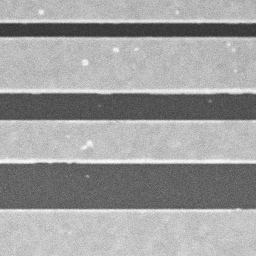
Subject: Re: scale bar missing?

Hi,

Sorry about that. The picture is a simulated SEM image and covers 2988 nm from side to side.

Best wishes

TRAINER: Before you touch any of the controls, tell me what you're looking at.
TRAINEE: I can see lines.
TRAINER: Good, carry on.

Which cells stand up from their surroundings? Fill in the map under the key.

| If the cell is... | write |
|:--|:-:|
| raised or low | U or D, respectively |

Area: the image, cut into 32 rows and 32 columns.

UUUUUUUUUUUUUUUUUUUUUUUUUUUUUUUU
UUUUUUUUUUUUUUUUUUUUUUUUUUUUUUUU
UUUUUUUUUUUUUUUUUUUUUUUUUUUUUUUU
DDDDDDDDDDDDDDDDDDDDDDDDDDDDDDDD
DDDDDDDDDDDDDDDDDDDDDDDDDDDDDDDD
UUUUUUUUUUUUUUUUUUUUUUUUUUUUUUUU
UUUUUUUUUUUUUUUUUUUUUUUUUUUUUUUU
UUUUUUUUUUUUUUUUUUUUUUUUUUUUUUUU
UUUUUUUUUUUUUUUUUUUUUUUUUUUUUUUU
UUUUUUUUUUUUUUUUUUUUUUUUUUUUUUUU
UUUUUUUUUUUUUUUUUUUUUUUUUUUUUUUU
UUUUUUUUUDUUUUUUUUUUUUUUUUUUUUUU
DDDDDDDDDDDDDDDDDDDDDDDDDDDDDDDD
DDDDDDDDDDDDDDDDDDDDDDDDDDDDDDDD
DDDDDDDDDDDDDDDDDDDDDDDDDDDDDDDD
UUUUUUUUUUUUUUUUUUUUUUUUUUUUUUUU
UUUUUUUUUUUUUUUUUUUUUUUUUUUUUUUU
UUUUUUUUUUUUUUUUUUUUUUUUUUUUUUUU
UUUUUUUUUUUUUUUUUUUUUUUUUUUUUUUU
UUUUUUUUUUUUUUUUUUUUUUUUUUUUUUUU
DDDDDDDDDDDDDDDDDDDDDDDDDDDDDDDD
DDDDDDDDDDDDDDDDDDDDDDDDDDDDDDDD
DDDDDDDDDDDDDDDDDDDDDDDDDDDDDDDD
DDDDDDDDDDDDDDDDDDDDDDDDDDDDDDDD
DDDDDDDDDDDDDDDDDDDDDDDDDDDDDDDD
DDDDDDDDDDDDDDDDDDDDDDDDDDDDDDDD
UUUUUUUUUUUUUUUUUUUUUUUUUUUUUUUU
UUUUUUUUUUUUUUUUUUUUUUUUUUUUUUUU
UUUUUUUUUUUUUUUUUUUUUUUUUUUUUUUU
UUUUUUUUUUUUUUUUUUUUUUUUUUUUUUUU
UUUUUUUUUUUUUUUUUUUUUUUUUUUUUUUU
UUUUUUUUUUUUUUUUUUUUUUUUUUUUUUUU